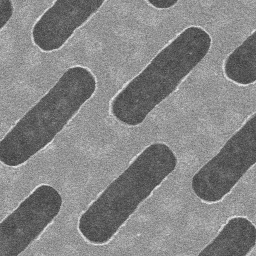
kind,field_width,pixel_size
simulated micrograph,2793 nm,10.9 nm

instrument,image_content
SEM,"holes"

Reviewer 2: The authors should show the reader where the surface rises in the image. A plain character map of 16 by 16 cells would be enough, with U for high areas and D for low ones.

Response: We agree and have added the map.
DUUDDDUUUUUUUUUU
UUDDDUUUUUUUUUUU
UUDDUUUUUUUDDUUD
UUUUUUUUUUDDDUDD
UUUUDDUUUDDDUUDD
UUUDDDUUDDDUUUUU
UUDDDUUDDDUUUUUU
UDDDUUUDDUUUUUUU
DDDUUUUUUUUUUUUD
DDUUUUUUUDDUUUDD
UUUUUUUUDDDUUDDD
UUUUUUUDDDUUDDDU
UUDDUUDDDUUUUUUU
UDDUUDDDUUUUUUUU
DDDUUDDUUUUUUUDD
DDUUUUUUUUUUUDDD